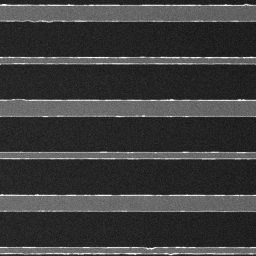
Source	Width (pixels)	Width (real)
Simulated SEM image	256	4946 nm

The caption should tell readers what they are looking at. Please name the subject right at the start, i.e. parallel lines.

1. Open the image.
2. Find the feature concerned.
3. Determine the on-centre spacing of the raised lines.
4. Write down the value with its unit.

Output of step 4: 918 nm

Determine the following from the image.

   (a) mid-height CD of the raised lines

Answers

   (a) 36.9 px